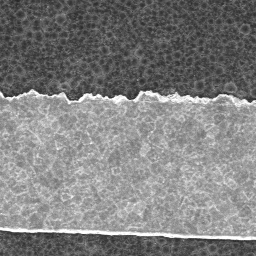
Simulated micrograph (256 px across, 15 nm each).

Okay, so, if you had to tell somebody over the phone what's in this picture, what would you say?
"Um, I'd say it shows one or a few lines or trenches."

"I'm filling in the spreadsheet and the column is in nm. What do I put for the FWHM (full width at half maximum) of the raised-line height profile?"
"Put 2050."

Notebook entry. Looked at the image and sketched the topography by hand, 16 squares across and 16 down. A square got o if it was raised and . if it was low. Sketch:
................
................
................
................
................
................
oooooooooooooooo
oooooooooooooooo
oooooooooooooooo
oooooooooooooooo
oooooooooooooooo
oooooooooooooooo
oooooooooooooooo
oooooooooooooooo
.....ooooooooooo
................